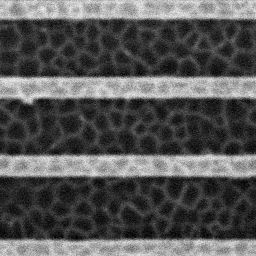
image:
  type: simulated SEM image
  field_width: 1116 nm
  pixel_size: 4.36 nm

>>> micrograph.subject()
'one or a few lines or trenches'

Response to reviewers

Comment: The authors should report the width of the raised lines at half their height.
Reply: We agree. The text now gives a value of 79.6 nanometers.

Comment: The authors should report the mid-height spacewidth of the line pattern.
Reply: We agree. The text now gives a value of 265 nanometers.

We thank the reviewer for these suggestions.